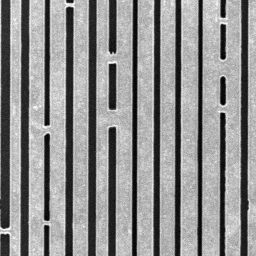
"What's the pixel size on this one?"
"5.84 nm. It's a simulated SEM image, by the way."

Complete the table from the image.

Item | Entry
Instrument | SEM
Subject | parallel lines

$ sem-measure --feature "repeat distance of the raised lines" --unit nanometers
127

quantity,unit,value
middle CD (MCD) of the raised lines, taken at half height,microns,0.084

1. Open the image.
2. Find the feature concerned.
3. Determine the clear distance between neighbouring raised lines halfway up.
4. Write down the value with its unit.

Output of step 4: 44.6 nanometres